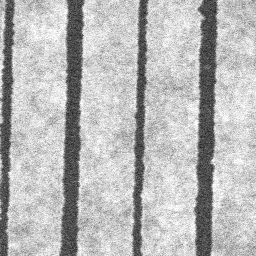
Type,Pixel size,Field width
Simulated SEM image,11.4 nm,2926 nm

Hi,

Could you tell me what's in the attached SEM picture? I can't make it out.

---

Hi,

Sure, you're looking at one or a few lines or trenches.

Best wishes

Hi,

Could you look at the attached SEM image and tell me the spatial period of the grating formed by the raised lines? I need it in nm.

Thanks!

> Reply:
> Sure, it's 762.